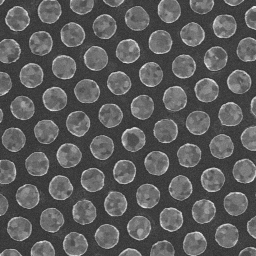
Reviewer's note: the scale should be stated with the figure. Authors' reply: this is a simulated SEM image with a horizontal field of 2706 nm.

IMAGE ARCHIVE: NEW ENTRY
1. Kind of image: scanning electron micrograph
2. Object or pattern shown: a regular array of raised bodies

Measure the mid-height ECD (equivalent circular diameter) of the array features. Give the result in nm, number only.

252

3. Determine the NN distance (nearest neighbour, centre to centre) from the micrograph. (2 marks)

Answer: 0.348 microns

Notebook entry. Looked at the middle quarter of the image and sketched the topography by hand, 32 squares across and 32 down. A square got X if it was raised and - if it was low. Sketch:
XXX---XXXX----------XXXX---XXXXX
XXX-----X----------XXXXX---XXXXX
XX----------XXX----XXXXXX---XXXX
X----------XXXXX---XXXXXX-------
----XXXX---XXXXXX---XXXX--------
---XXXXX---XXXXXX----X----------
---XXXXXX---XXXX----------XXXX--
---XXXXXX----XX----------XXXXX--
X--XXXXXX---------XXXX---XXXXXX-
X---XXX----------XXXXX---XXXXXX-
----------XXX----XXXXX---XXXXX--
---------XXXXX---XXXXX-----XX---
--XXX----XXXXXX--XXXXX----------
-XXXXX---XXXXXX----XX----------X
-XXXXX---XXXXX----------XXX----X
-XXXXX----XXX----------XXXXX---X
-XXXXX----------XXX---XXXXXX---X
--XXX----------XXXXX--XXXXXX----
--------XXX----XXXXX---XXXXX----
-------XXXXX---XXXXX----XX------
XXX----XXXXX---XXXXX----------XX
XXXX---XXXXX----XXX----------XXX
XXXX---XXXXX---------XXXX---XXXX
XXXX----XXX----------XXXXX---XXX
XXXX----------XXX---XXXXXX---XXX
XX-----------XXXXX--XXXXXX----XX
------XXX---XXXXXX---XXXXX------
-----XXXXX--XXXXXX----XXX-------
X---XXXXXX---XXXX-----------XXX-
X---XXXXXX----XXX----------XXXXX
XX---XXXXX---------XXX----XXXXXX
XX----XXX---------XXXXXX--XXXXXX